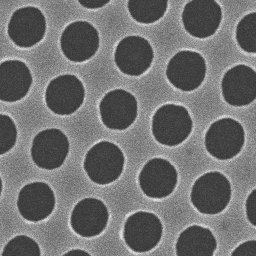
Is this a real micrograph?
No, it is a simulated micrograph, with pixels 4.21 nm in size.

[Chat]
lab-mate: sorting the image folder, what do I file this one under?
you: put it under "a regular array of holes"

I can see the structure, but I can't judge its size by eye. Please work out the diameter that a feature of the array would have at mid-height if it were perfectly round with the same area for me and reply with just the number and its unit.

168 nanometres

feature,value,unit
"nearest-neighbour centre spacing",232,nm